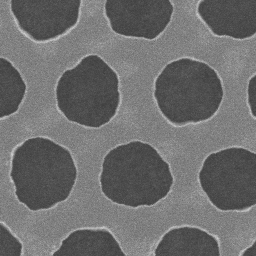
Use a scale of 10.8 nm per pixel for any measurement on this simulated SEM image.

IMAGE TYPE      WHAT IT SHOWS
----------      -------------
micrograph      holes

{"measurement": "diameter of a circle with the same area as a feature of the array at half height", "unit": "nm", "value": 732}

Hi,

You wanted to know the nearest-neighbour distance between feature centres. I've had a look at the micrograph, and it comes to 1000 nm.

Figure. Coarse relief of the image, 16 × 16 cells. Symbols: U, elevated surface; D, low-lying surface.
UDDDDUUDDDDUDDDD
UDDDDUUDDDUUUDDD
UUDUUUUUUUUUUUUU
UUUUUUUUUUUUUUUU
DUUUDDDUUUDDDUUU
DDUUDDDUUUDDDDUU
DUUUDDDUUUDDDDUU
UUUUDDDUUUUDDUUU
UUUUUUUUUUUUUUUU
UDDDUUUDDDUUUUDD
UDDDDUDDDDDUUDDD
UDDDDUDDDDDUUDDD
UDDDUUUDDDUUUDDD
UUUUUUUUUUUUUUUU
DUUUUDDUUUUDDUUU
DUUUDDDDUUDDDDUU